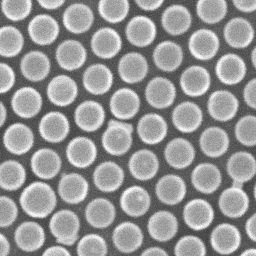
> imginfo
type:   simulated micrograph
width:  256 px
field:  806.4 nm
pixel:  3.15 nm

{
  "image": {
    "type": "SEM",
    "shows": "a regular array of raised bodies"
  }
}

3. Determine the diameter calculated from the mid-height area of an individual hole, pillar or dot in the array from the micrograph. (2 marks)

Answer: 91.6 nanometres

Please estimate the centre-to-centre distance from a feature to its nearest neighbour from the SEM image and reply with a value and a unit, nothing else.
0.115 microns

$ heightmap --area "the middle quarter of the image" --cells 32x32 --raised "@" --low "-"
@@@@---@@@----@@@@@@@--@@@@@@---
------@@@@@---@@@@@@@----@@---@@
-----@@@@@@@--@@@@@@@---------@@
@----@@@@@@@---@@@@@---------@@@
@@---@@@@@@@----@@----@@@@@--@@@
@@@--@@@@@@----------@@@@@@--@@@
@@@---@@@@@---@@-----@@@@@@@--@@
@@@----------@@@@@--@@@@@@@@---@
@@@---------@@@@@@@--@@@@@@-----
@@----@-----@@@@@@@--@@@@@@-----
----@@@@@---@@@@@@@---@@@@---@@@
---@@@@@@@--@@@@@@----------@@@@
---@@@@@@@---@@@@@---------@@@@@
---@@@@@@@----@@----@@@@---@@@@@
@--@@@@@@@---@-----@@@@@@--@@@@@
@---@@@@@---@@@----@@@@@@@--@@@@
@----@@@---@@@@@--@@@@@@@@---@@@
@---------@@@@@@---@@@@@@-------
----------@@@@@@@--@@@@@@-------
--@@@@@---@@@@@@@---@@@----@@@@-
-@@@@@@@--@@@@@@@---------@@@@@@
-@@@@@@@---@@@@@---------@@@@@@@
-@@@@@@@----@@----@@@@@--@@@@@@@
-@@@@@@@---------@@@@@@--@@@@@@@
--@@@@@----------@@@@@@---@@@@@@
---@@----@@@@---@@@@@@@----@@@@-
--------@@@@@@---@@@@@@---------
--------@@@@@@@--@@@@@@---------
@@@@@---@@@@@@@---@@@----@@@@---
@@@@@---@@@@@@----------@@@@@@--
@@@@@@--@@@@@@---------@@@@@@@--
@@@@@@----@@----@@@@---@@@@@@@--